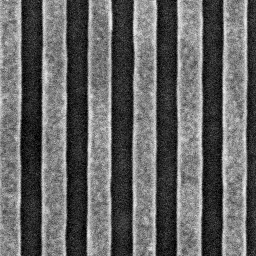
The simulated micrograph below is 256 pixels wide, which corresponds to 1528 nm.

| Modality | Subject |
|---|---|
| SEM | wiring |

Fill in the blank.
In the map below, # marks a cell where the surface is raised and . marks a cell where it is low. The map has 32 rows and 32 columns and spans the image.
###..###...###...###..###...###.
###..###...###...###..###...###.
###..###...###...###..###...###.
###..###...###...##...###...###.
###..###...###...##...###...###.
###..###...###...##...###...###.
###..###...###...##...###...###.
###..###...###...##...###...###.
###..###...###...##...###...###.
###..###...###...##...###...###.
###..###...###...##...###...###.
###..###...###...##...###...###.
###..###...###...##...###...###.
###..###...###...##...###...###.
###..###...###...##...###...###.
##...###...###...##...###...###.
##...###...###...##...###...###.
##...###...###...##...###...###.
##...###...###...##...###...###.
##...###...###...##...###...###.
###..###...###...##...###...###.
###..###...###...##...###...###.
###..###...###...##...###...###.
##...###...###...##...###...###.
##...###...###...##...###...###.
##...###...###...##...###...###.
##...###...###...##...###...###.
##...###...###...##...###...###.
##...###...###...##...###...###.
##...###...###...##...###...###.
##...###...###...##...###...###.
##...###...###...##...###...###.